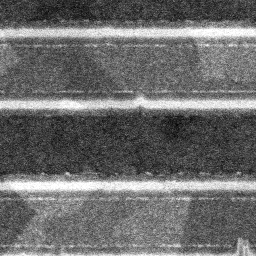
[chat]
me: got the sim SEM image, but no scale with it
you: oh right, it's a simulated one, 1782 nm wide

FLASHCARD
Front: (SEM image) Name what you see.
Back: one or a few lines or trenches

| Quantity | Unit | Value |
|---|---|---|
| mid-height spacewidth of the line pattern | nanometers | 560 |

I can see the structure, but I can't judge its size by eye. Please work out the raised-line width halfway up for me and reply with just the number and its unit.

0.508 microns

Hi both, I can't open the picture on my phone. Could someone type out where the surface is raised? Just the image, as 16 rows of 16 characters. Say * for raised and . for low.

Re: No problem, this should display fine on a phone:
................
................
****************
****************
****************
****************
********.*******
................
................
................
................
................
****************
****************
****************
****************